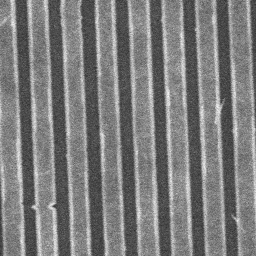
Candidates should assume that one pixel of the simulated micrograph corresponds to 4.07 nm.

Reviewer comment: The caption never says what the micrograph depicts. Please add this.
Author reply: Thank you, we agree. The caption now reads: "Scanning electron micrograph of parallel lines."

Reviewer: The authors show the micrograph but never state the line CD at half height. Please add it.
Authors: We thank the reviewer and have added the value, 75.2 nanometers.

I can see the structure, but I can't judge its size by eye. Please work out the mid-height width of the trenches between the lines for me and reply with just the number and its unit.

60.5 nanometers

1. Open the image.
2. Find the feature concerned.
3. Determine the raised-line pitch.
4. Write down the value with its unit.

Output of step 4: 137 nanometers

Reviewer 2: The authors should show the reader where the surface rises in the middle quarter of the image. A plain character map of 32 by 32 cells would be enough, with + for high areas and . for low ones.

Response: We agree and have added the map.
+++++....++++....+++++...+++++..
+++++....++++....+++++...+++++..
+++++....++++....+++++...+++++..
+++++....++++....+++++...+++++..
+++++....++++....+++++...+++++..
+++++....++++....+++++....++++..
+++++....++++....+++++....++++..
+++++....++++....+++++....++++..
.++++....++++....+++++....++++..
.++++....++++....+++++....++++..
.++++....++++....+++++....++++..
.++++....++++....+++++....++++..
.++++....++++....+++++....++++..
.++++....++++....+++++....++++..
.++++....+++++...+++++....++++..
.++++....+++++....++++....+++++.
.++++....+++++....++++....+++++.
.++++....+++++....++++....+++++.
.++++....+++++....++++....+++++.
.++++....+++++....++++....+++++.
.++++....+++++....++++....+++++.
.++++....+++++....++++....+++++.
.++++....+++++....++++....+++++.
.+++++...+++++....++++....+++++.
.+++++....++++....+++++...+++++.
.+++++....++++....+++++...+++++.
.+++++....++++....+++++...+++++.
.+++++....++++....+++++...+++++.
.+++++....++++....+++++...+++++.
.+++++....++++....+++++...+++++.
.+++++....++++....+++++....++++.
.+++++....++++....+++++....++++.